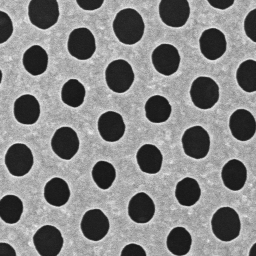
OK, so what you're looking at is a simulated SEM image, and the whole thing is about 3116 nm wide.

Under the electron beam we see a regular array of holes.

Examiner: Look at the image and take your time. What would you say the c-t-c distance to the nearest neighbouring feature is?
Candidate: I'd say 0.6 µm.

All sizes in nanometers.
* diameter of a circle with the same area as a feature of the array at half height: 360